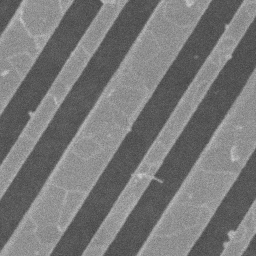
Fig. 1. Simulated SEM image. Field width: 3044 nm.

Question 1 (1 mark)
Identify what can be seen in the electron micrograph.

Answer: lines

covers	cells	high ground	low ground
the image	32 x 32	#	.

...######....###....######....##
..######....###....######.....##
..######....##.....######....###
.######....###....######....###.
######....###.....######....##..
######....##.....######....###..
#####....###....######....###...
####.....##.....######....###...
####....##.....######....###....
###....###....######.....##.....
###....##.....######....##.....#
##....##.....######....###.....#
#....###.....######....##.....##
#....##.....######....###....###
....###....######....###.....###
...###....#######....##.....####
...##.....######....###....#####
..###....######....###.....#####
.###.....######....##.....######
.###....######....###....######.
###....######.....##.....######.
##.....######....##.....######..
##....######....###....######...
#.....#####.....##.....######...
.....######....###....######....
....######....###....######.....
....######....##.....######....#
...######....###....######....##
..######....###....#######....##
..######....##.....######....###
.######....###....######....###.
######....###.....######....##..